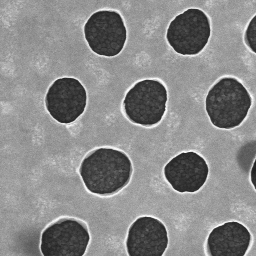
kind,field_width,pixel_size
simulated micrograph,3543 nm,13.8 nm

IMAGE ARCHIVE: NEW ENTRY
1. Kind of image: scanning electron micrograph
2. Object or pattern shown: holes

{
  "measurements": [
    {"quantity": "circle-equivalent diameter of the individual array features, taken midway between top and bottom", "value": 610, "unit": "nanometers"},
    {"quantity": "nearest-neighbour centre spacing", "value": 1100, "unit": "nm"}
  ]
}